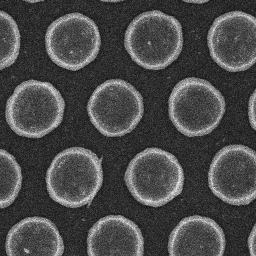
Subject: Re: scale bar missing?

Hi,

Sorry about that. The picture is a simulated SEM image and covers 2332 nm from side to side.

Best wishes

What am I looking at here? raised bodies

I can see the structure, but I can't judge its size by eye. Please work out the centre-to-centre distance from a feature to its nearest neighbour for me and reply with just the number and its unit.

713 nm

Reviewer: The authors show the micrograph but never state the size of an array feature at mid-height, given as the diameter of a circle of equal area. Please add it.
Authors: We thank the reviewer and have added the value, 483 nanometers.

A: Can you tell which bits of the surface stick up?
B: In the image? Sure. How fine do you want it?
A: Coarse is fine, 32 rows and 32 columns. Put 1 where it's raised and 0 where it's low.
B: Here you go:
00000000000000000000000000000000
00000000000000000000000000000000
10000000111000000111110000011111
11000011111100001111110000011111
11000011111100001111111000111111
11000011111100001111111000111111
11000011111100001111110000111111
10000001111000000111110000011111
00000000000000000001000000000100
00000000000000000000000000000000
00001100000001100000000111000000
00111110000011111000001111100000
01111110000111111100011111110001
01111111000111111100011111110001
01111111000111111100011111110001
01111110000011111000001111100000
00111100000001110000000111000000
00000000000000000000000000000000
00000000000000000000000000000100
10000001111100000111100000011111
11000001111100001111110000011111
11000011111100001111111000111111
11100011111110001111111000111111
11000011111100000111110000111111
11000001111100000111110000011111
10000000110000000000000000000000
00000000000000000000000000000000
00011100000001110000000111000000
00111110000011111000001111100000
01111110000111111100001111110001
01111111000111111100011111110001
01111110000111111100011111110001